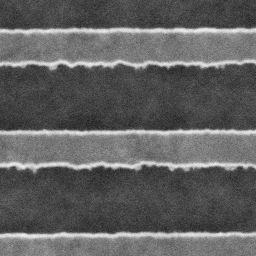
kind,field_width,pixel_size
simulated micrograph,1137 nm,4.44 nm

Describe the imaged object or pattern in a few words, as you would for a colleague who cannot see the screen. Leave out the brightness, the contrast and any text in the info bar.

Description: lines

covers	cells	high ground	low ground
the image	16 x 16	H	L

LLLLLLLLLLLLLLLL
LLLLLLLLLLLLLLLL
HHHHHHHHHHHHHHHH
HHHHHHHHHHHHHHHH
LLLLLLLLLLLLLLLL
LLLLLLLLLLLLLLLL
LLLLLLLLLLLLLLLL
LLLLLLLLLLLLLLLL
HHHHHHHHHHHHHHHH
HHHHHHHHHHHHHHHH
LLLLLLLLLLLLLLLL
LLLLLLLLLLLLLLLL
LLLLLLLLLLLLLLLL
LLLLLLLLLLLLLLLL
LLLLLLLLLLLLLLLL
HHHHHHHHHHHHHHHH